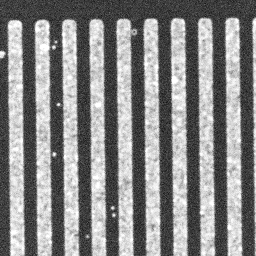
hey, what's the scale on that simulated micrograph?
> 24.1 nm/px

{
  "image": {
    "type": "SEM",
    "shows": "groups of lines, slits or small figures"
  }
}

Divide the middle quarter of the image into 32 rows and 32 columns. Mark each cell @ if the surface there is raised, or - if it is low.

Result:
@@@----@@@----@@@---@@@----@@@--
@@@----@@@----@@@---@@@----@@@--
@@@----@@@----@@@---@@@----@@@--
@@@----@@@----@@@---@@@----@@@--
@@@----@@@----@@@---@@@----@@@--
@@@----@@@----@@@---@@@----@@@--
@@@----@@@----@@@---@@@----@@@--
@@@----@@@----@@@---@@@----@@@--
@@@----@@@----@@@---@@@----@@@--
@@@----@@@----@@@---@@@----@@@--
@@@----@@@----@@@---@@@----@@@--
@@@----@@@----@@@---@@@----@@@--
@@@----@@@----@@@---@@@----@@@--
@@@----@@@----@@@---@@@----@@@--
@@@----@@@----@@@---@@@----@@@--
@@@----@@@----@@@---@@@----@@@--
@@@----@@@----@@@---@@@----@@@--
@@@----@@@----@@@---@@@----@@@--
@@@----@@@----@@@---@@@----@@@--
@@@----@@@----@@@----@@@---@@@--
@@@----@@@----@@@----@@@---@@@--
@@@----@@@----@@@----@@@---@@@--
@@@----@@@----@@@----@@@---@@@--
@@@----@@@----@@@----@@@---@@@--
@@@----@@@----@@@----@@@---@@@--
@@@----@@@----@@@----@@@---@@@--
@@@----@@@----@@@----@@@---@@@--
@@@----@@@----@@@----@@@---@@@--
@@@----@@@----@@@----@@@---@@@--
@@@----@@@----@@@----@@@---@@@--
@@@----@@@----@@@----@@@---@@@--
@@@----@@@----@@@----@@@---@@@--